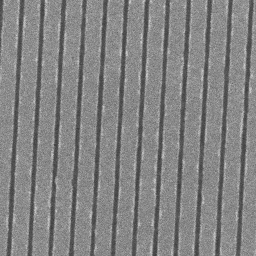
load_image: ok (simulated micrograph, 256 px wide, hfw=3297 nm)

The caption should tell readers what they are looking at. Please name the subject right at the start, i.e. parallel lines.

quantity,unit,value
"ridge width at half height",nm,201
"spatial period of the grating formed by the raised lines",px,20.8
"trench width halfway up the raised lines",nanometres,67.5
